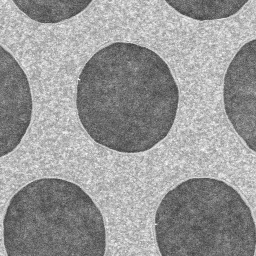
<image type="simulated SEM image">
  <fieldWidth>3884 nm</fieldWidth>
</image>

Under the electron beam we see holes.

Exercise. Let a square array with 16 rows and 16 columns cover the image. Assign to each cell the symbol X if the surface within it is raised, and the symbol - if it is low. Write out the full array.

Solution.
X----XXXXXX----X
XXXXXXXXXXXXXXXX
XXXXXXXXXXXXXXXX
-XXXXX----XXXXX-
-XXXX------XXX--
--XXX------XXX--
--XXX------XXX--
--XXX------XXX--
-XXXXX----XXXXX-
-XXXXXX--XXXXXXX
XXXXXXXXXXXXXXXX
XX---XXXXXX---XX
X-----XXXX-----X
------XXXX------
-------XXX------
-------XXX------